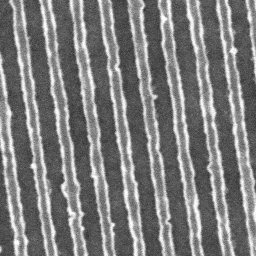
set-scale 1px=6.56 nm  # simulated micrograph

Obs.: parallel lines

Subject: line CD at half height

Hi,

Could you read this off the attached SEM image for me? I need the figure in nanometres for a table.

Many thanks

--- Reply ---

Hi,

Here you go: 69.1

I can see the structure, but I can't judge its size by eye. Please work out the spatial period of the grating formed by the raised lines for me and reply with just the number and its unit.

191 nanometres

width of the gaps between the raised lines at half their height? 0.121 um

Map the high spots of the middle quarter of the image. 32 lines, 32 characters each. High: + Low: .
....++.....++......++.....++....
....++.....+++.....++.....+++...
....+++....+++.....++.....+++...
....+++....+++.....++.....+++...
....+++.....++.....+++....+++...
....+++.....++.....++.....+++...
.....++.....++.....+++.....++...
.....++.....++.....+++.....+++..
+....++.....+++....++++....+++..
+....+++....+++.....++.....+++..
+....+++.....++.....++.....+++..
+....+++.....++.....+++.....++..
+....+++.....++.....+++.....++..
+.....++.....++.....+++.....++..
+.....++.....++.....+++.....++..
+.....++.....+++....+++.....++..
+.....+++....+++.....++.....++..
+.....+++....+++.....+++....+++.
++....+++....+++.....+++....+++.
++.....++....+++.....++.....+++.
++.....++.....++.....++......++.
++.....++.....++.....++......++.
++.....++.....++......++.....++.
++.....+++....+++.....++.....+++
++.....+++.....++.....+++....+++
++.....+++.....++.....+++....+++
++.....+++.....++.....+++....+++
+++....+++.....++.....+++.....++
+++.....++.....++.....+++.....++
+++.....++.....+++.....++.....++
++++....+++....+++.....++.....++
++++....+++....+++.....++.....++